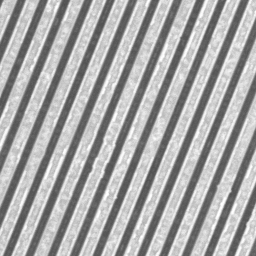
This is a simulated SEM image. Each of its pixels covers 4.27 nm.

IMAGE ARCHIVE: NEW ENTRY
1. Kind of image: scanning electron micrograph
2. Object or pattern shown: parallel lines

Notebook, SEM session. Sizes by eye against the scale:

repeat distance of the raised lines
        20.7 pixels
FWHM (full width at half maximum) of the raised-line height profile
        0.0539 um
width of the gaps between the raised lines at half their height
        33.2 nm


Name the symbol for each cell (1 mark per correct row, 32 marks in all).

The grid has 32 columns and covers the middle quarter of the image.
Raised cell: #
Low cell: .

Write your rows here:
####..####..###..####..###..####
###...###..####..###..####..####
###..####..###..####..###...###.
###..###..####..####..###..####.
##...###..###...###..####..###..
##..####..###..####..###..####..
#...###..####..###..####..####..
#..####..###..####..###...###..#
#..###..####..###...###..####..#
...###..###..####..####..###..##
..###...###..####..###..####..##
..###..####..###..####..###...##
.####..###..####..###..####..###
.###..####..###...###..####..###
.###..###..####..####..###..####
###...###..####..###..####..###.
###..####..###..####..###...###.
###..###..####..###..####..####.
##..####..###...###..####..###..
##..###...###..####..###..####..
#...###..####..###..####..###..#
#..###...###..####..###...###..#
#..###..####..###..####..####..#
..####..####..###..####..###..##
..###..####..###...###..####..##
..###..####..###..####..###..###
.###...###..####..###...###..###
.###..####..###..####..###...###
####..###...###..####..###..####
###..####..###...###..####..###.
###..####..###..####..###..####.
##...###..####..###...###..###..